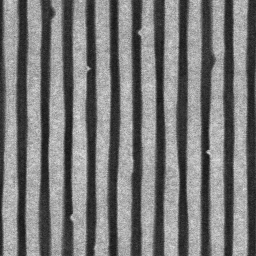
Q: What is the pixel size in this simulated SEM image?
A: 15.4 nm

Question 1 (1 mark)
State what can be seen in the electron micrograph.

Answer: parallel lines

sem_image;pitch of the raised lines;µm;0.354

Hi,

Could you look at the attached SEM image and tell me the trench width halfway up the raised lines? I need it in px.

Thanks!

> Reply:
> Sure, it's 8.87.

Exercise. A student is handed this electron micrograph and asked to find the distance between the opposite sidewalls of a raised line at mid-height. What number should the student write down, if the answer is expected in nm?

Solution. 222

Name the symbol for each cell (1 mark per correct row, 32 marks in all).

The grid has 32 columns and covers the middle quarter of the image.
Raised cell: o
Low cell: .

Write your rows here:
..oooo..ooo...ooo..oooo..ooo...o
..oooo..ooo...ooo..oooo..ooo...o
..oooo..oooo..ooo..oooo..ooo...o
..oooo..oooo..ooo..oooo..ooo...o
..oooo..oooo..ooo..oooo..ooo...o
..oooo..oooo..ooo..oooo..ooo...o
..oooo..oooo..ooo...ooo..ooo...o
..oooo..oooo..ooo...ooo..ooo...o
..ooo...oooo..ooo...ooo..ooo...o
..ooo...oooo..ooo...ooo..ooo...o
..ooo...oooo..ooo..oooo..ooo...o
..ooo...oooo..ooo..oooo..ooo...o
..ooo...oooo..ooo..oooo..ooo...o
..ooo...ooo...ooo..oooo..ooo...o
..oooo..ooo...ooo..oooo..ooo...o
..oooo..ooo...ooo..oooo..ooo...o
..oooo..ooo...ooo..oooo..ooo...o
..oooo..ooo...ooo..oooo..ooo...o
..oooo..ooo...ooo..oooo..ooo...o
..oooo..ooo...ooo..oooo..ooo...o
..oooo..ooo...ooo..oooo..ooo...o
..oooo..ooo...ooo..oooo..ooo..oo
..oooo..ooo...ooo..oooo..ooo..oo
..oooo..ooo...ooo..oooo..ooo..oo
..oooo..ooo...ooo..oooo..ooo..oo
..oooo..ooo...ooo..oooo..oooo.oo
..oooo..ooo..oooo..oooo..oooo.oo
..oooo..ooo..oooo..oooo..oooo.oo
..oooo..ooo..oooo..oooo..oooo.oo
..oooo..ooo..oooo..oooo..oooo.oo
..oooo..ooo..oooo..oooo..oooo.oo
..oooo..ooo..oooo..oooo..oooo..o